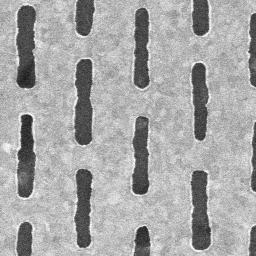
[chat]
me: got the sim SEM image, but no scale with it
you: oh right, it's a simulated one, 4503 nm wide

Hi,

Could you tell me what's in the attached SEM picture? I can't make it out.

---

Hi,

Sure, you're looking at a regular array of holes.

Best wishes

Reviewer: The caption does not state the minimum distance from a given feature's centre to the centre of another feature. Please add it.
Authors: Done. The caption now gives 1360 nm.